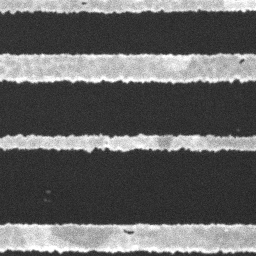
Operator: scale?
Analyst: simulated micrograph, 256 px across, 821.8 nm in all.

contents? lines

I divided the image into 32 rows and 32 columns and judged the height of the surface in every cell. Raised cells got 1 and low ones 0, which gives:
11111111110111111111111111111111
00000001100001000000000000000000
00000000000000000000000000000000
00000000000000000000000000000000
00000000000000000000000000000000
00000000000000000000000000000000
00000000000000000000000000000000
11111111111111111111111111111101
11111111111111111111111111111111
11111111111111111111111111111111
00000000000000000000000000000000
00000000000000000000000000000000
00000000000000000000000000000000
00000000000000000000000000000000
00000000000000000000000000000000
00000000000000000000000000000000
00000000000000000000000000000000
11111111111111111111111111111111
10111111111110111011111111111111
00000000000000000000000000000000
00000000000000000000000000000000
00000000000000000000000000000000
00000000000000000000000000000000
00000000000000000000000000000000
00000000000000000000000000000000
00000000000000000000000000000000
00000000000000000000000000000000
00000000000000000000000000000000
11111111111111101111111111111111
11111111111111110111111111111111
11111111111111111111111111111111
00000000000000000000000000000000